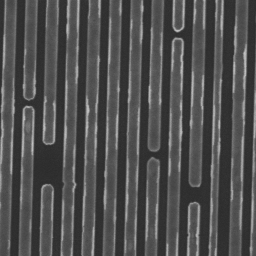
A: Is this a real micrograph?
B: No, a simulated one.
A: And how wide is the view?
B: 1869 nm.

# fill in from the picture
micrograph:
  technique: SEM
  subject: parallel lines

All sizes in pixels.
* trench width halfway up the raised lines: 9.86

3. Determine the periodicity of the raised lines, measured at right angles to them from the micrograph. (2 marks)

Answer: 153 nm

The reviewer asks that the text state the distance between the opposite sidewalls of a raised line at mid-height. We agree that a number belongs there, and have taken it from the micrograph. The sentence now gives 83.9 nanometres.